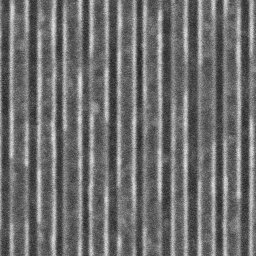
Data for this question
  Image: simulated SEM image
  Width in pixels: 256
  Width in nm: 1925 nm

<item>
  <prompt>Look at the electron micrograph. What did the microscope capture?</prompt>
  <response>parallel lines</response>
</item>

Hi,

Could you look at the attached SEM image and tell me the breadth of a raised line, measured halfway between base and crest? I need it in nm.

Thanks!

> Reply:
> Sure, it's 135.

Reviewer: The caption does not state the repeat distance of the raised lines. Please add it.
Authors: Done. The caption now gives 200 nm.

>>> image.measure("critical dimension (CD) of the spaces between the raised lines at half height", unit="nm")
71.4